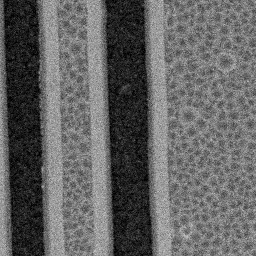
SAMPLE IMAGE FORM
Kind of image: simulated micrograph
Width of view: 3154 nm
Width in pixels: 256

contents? one or a few lines or trenches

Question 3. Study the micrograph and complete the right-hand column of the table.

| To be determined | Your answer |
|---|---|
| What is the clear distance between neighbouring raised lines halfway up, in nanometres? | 756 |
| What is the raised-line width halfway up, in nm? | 552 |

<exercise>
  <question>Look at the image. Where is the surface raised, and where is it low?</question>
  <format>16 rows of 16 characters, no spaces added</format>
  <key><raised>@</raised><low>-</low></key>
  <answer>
---@@@----@@@@@@
---@@@----@@@@@@
---@@@----@@@@@@
---@@@----@@@@@@
---@@@----@@@@@@
---@@@----@@@@@@
---@@@----@@@@@@
---@@@----@@@@@@
---@@@----@@@@@@
---@@@----@@@@@@
---@@@----@@@@@@
---@@@----@@@@@@
---@@@----@@@@@@
---@@@----@@@@@@
----@@----@@@@@@
----@@----@@@@@@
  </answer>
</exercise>